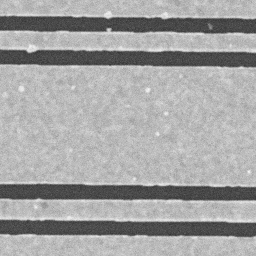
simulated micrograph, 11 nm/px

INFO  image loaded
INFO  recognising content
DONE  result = lines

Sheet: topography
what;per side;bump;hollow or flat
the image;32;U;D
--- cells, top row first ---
UUUUUUUUUUUUUUUUUUUUUUUUUUUUUUUU
UUUUUUUUUUUUUUUUUUUUUUUUUUUUUUUU
DDDDDDDDDDDDDDDDDDDDDDDDDDDDDDDD
DDDDDDDDDDDDDDDDDDDDDDDDDDDDDDDD
UUUUUUUUUUUUUUUUUUUUUUUUUUUUUUUU
UUUUUUUUUUUUUUUUUUUUUUUUUUUUUUUU
DDDDDDDDDDDDDDDDDDDDDDDDDDDDDDDD
DDDDDDDDDDDDDDDDDDDDDDDDDDDDDDDD
UUUUUUUUUUUUUUUUUUUUUUUUUUUUUDUD
UUUUUUUUUUUUUUUUUUUUUUUUUUUUUUUU
UUUUUUUUUUUUUUUUUUUUUUUUUUUUUUUU
UUUUUUUUUUUUUUUUUUUUUUUUUUUUUUUU
UUUUUUUUUUUUUUUUUUUUUUUUUUUUUUUU
UUUUUUUUUUUUUUUUUUUUUUUUUUUUUUUU
UUUUUUUUUUUUUUUUUUUUUUUUUUUUUUUU
UUUUUUUUUUUUUUUUUUUUUUUUUUUUUUUU
UUUUUUUUUUUUUUUUUUUUUUUUUUUUUUUU
UUUUUUUUUUUUUUUUUUUUUUUUUUUUUUUU
UUUUUUUUUUUUUUUUUUUUUUUUUUUUUUUU
UUUUUUUUUUUUUUUUUUUUUUUUUUUUUUUU
UUUUUUUUUUUUUUUUUUUUUUUUUUUUUUUU
UUUUUUUUUUUUUUUUUUUUUUUUUUUUUUUU
UUUUUUUUUUUUUUUUUUUUUUUUUUUUUUUU
DDDDDDDDDDDDDDDDDDDDDDDDDDDDDDDD
DDDDDDDDDDDDDDDDDDDDDDDDDDDDDDDD
UUUUUUUUUUUUUUUUUUUUUUUUUUUUUUUU
UUUUUUUUUUUUUUUUUUUUUUUUUUUUUUUU
DDDDDDDDDDDDDDUUDDUUUUUUUUUUUUUU
DDDDDDDDDDDDDDDDDDDDDDDDDDDDDDDD
UUUUUUUUUUUUUUUUDUUDDDUDDDDDDDDD
UUUUUUUUUUUUUUUUUUUUUUUUUUUUUUUU
UUUUUUUUUUUUUUUUUUUUUUUUUUUUUUUU